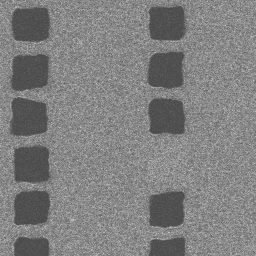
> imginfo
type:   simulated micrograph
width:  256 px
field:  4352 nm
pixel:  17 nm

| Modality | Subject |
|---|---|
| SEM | a regular array of holes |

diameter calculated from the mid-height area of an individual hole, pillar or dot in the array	654	nm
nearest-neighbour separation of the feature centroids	792	nm